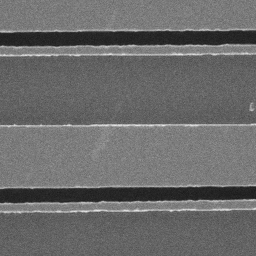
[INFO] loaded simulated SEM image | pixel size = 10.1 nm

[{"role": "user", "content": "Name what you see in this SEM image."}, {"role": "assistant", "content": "lines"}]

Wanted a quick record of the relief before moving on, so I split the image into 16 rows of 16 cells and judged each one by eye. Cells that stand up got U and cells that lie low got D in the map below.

UUUUUUUUUUUUUUUU
UUUUUUUUUUUUUUUU
DDDDDDDDDDDDDDDD
DDDDDDDDDDDDDDDD
DDDDDDDDDDDDDDDD
DDDDDDDDDDDDDDDD
DDDDDDDDDDDDDDDD
DDDDDDDDDDDDDDDD
UUUUUUUUUUUUUUUU
UUUUUUUUUUUUUUUU
UUUUUUUUUUUUUUUU
UUUUUUUUUUUUUUUU
DDDDDDDDDDDDDDUU
DDDDDDDDDDDDDDDD
DDDDDDDDDDDDDDDD
DDDDDDDDDDDDDDDD